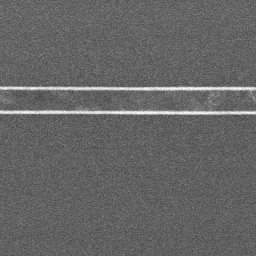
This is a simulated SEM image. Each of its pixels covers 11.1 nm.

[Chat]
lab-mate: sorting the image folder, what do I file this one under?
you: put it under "one or a few lines or trenches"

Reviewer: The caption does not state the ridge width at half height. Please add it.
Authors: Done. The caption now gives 281 nm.